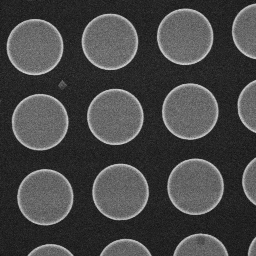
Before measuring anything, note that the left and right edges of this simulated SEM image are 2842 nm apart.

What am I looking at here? an array of small figures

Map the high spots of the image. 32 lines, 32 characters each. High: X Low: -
--------------------------------
----------------------XXX-----XX
---XX------XXXXX----XXXXXX---XXX
--XXXXX----XXXXXX---XXXXXX---XXX
-XXXXXXX--XXXXXXX---XXXXXXX--XXX
-XXXXXXX--XXXXXXX---XXXXXXX--XXX
-XXXXXXX--XXXXXXX---XXXXXX----XX
-XXXXXX----XXXXX-----XXXX-------
--XXXXX------XX-----------------
--------------------------------
-----------------------X-------X
-------------XXX-----XXXXX----XX
---XXXX-----XXXXX----XXXXXX---XX
--XXXXXX---XXXXXXX--XXXXXXX---XX
--XXXXXX---XXXXXXX--XXXXXXX---XX
--XXXXXXX--XXXXXXX---XXXXXX----X
--XXXXXX----XXXXX----XXXXX------
--XXXXXX-----XXX----------------
----XX--------------------------
--------------------------------
---------------X------XXXX-----X
----XXX------XXXX----XXXXXX----X
---XXXXX----XXXXXX---XXXXXXX--XX
--XXXXXXX---XXXXXXX--XXXXXXX--XX
--XXXXXXX---XXXXXXX--XXXXXXX---X
--XXXXXXX---XXXXXX----XXXXX-----
---XXXXXX----XXXX------XXX------
----XXXX------------------------
--------------------------------
------------------------XX------
--------------XXXX----XXXXXX---X
----XXXXX----XXXXXX---XXXXXX---X